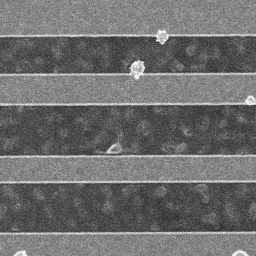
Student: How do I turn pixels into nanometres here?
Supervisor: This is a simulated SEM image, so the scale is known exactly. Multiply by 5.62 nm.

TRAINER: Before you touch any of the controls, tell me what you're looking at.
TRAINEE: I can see one or a few lines or trenches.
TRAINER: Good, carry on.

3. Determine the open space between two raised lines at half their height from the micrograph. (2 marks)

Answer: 285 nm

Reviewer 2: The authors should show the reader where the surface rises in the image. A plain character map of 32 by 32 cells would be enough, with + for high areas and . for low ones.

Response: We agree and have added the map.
++++++++++++++++++++++++++++++++
++++++++++++++++++++++++++++++++
++++++++++++++++++++++++++++++++
++++++++++++++++++++++++++++++++
..+++..............++...........
................................
................................
................................
................++..............
++++++++++++++++++++++++++++++++
++++++++++++++++++++++++++++++++
++++++++++++++++++++++++++++++++
++++++++++++++++++++++++++++++++
................................
................................
................................
................................
................................
..............+.................
.............++.................
++++++++++++++++++++++++++++++++
++++++++++++++++++++++++++++++++
++++++++++++++++++++++++++++++++
................................
................................
................................
................................
................................
................................
++++++++++++++++++++++++++++++++
++++++++++++++++++++++++++++++++
++++++++++++++++++++++++++++++++